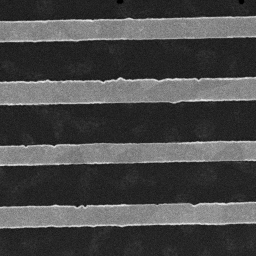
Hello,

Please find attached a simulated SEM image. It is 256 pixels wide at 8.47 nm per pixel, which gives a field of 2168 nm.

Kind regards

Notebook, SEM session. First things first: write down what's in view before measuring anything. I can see one or a few lines or trenches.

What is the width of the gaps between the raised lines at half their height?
348 nm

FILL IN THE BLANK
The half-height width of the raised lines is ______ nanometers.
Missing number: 175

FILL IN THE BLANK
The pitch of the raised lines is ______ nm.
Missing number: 525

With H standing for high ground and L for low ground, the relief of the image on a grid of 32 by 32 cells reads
LLLLLLLLLLLLLLLLLLLLLLLLLLLLLLLL
LLLLLLLLLLLLLLLLLLLLLLLLLLLLLLLL
LLLLLLLLHHLLHHHHHHHHHHHHHHHHHHHH
HHHHHHHHHHHHHHHHHHHHHHHHHHHHHHHH
HHHHHHHHHHHHHHHHHHHHHHHHHHHHHHHH
LLLLLLLLLLLLLLLLLLLLLLLLLLLLLLLL
LLLLLLLLLLLLLLLLLLLLLLLLLLLLLLLL
LLLLLLLLLLLLLLLLLLLLLLLLLLLLLLLL
LLLLLLLLLLLLLLLLLLLLLLLLLLLLLLLL
LLLLLLLLLLLLLLLLLLLLLLLLLLLLLLLL
HHHHHHHHHHHHHHHHHHHHHHHHHHHHHHHH
HHHHHHHHHHHHHHHHHHHHHHHHHHHHHHHH
HHHHHHHHHHHHHHHHHHHHHHHHHHHHHHLL
LLLLLLLLLLLLLLLLLLLLLLLLLLLLLLLL
LLLLLLLLLLLLLLLLLLLLLLLLLLLLLLLL
LLLLLLLLLLLLLLLLLLLLLLLLLLLLLLLL
LLLLLLLLLLLLLLLLLLLLLLLLLLLLLLLL
LLLHLLLLLLLLLLLLLLLLLLLLLLLLLLLL
HHHHHHHHHHHHHHHHHHHHHHHHHHHHHHHH
HHHHHHHHHHHHHHHHHHHHHHHHHHHHHHHH
HHHHHHHHHLLLLLLLLLLLLLLLLLLLLLLL
LLLLLLLLLLLLLLLLLLLLLLLLLLLLLLLL
LLLLLLLLLLLLLLLHHLLLLLLLLLLLLLLL
LLLLLLLLLLLLLLLHLLLLLLLLLLLLLLLL
LLLLLLLLLLLLLLLLLLLLLLLLLLLLLLLL
LLLLLLLLLLLLLLLLLLLLLLLHLHHHHHHH
HHHHHHHHHHHHHHHHHHHHHHHHHHHHHHHH
HHHHHHHHHHHHHHHHHHHHHHHHHHHHHHHH
LLLLLLLLLLLLLHLLLLLLLLLLLLLLLLLL
LLLLLLLLLLLLLLLLLLLLLLLLLLLLLLLL
LLLLLLLLLLLHLLLLLLLLLLLLLLLLLLLL
LLLLLLLLLLLLLLLLLLLLLLLLLLLLLLLL